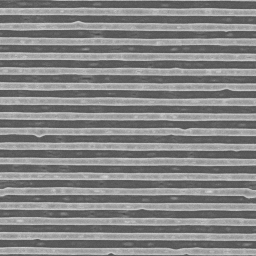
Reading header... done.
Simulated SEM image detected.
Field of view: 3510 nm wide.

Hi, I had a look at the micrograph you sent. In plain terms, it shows parallel lines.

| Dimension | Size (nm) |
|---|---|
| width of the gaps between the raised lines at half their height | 106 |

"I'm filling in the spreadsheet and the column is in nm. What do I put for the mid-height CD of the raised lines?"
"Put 92.5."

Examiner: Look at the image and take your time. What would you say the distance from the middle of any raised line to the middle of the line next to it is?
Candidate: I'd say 205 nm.